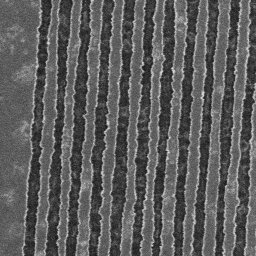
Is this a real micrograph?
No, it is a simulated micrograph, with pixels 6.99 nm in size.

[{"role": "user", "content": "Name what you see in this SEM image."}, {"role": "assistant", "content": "parallel lines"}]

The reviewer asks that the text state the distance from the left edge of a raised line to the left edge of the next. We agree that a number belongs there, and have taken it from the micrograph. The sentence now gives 0.146 micrometres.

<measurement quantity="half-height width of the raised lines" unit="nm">73.3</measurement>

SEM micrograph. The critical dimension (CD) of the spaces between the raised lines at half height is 74.1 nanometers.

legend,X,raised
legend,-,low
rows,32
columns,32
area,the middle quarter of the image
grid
-XX---XXX--XXX---XXX--XXX--XXX--
-XX---XXX--XXX---XXX--XXX--XXX--
-XX---XXX--XXX---XX---XX---XXX--
-XX---XXX--XXX---XX---XX---XXX--
-XX---XXX--XXX--XXX---XX---XX---
-X----XX---XXX---XX---XX---XX---
XXX---XXX--XXX--XXX---XX---XX---
XXX---XX---XXX--XXX---XX---XX---
XX----XX---XXX--XXX---XX---XX---
XX----XX---XXX--XXX---XX---XX---
XX----XX---XX---XXX---XX---XX---
XX----XX---XXX--XXX---XX---XX---
XX----XX---XX---XXX---XX---XX---
XX---XXX---XX---XXX--XXX---XX---
XX----X----XX---XX----XX---XX---
XX---XXX---XX---XX---XX----XX---
XX---XXX--XXX---XX---XXX--XX----
XX---XX---XXX---XXX--XXX--XXX---
XX---XXX--XXX---XX---XXX--XX---X
XX---XXX--XXX---XX---XX---XX----
XX---XX----XX---XX---XX---XXX--X
XX---XX---XXX---XX---XX---XXX--X
XX---XX---XXX---XX---XX---XXX--X
X----XX---XXX---XX---XX---XX---X
X----XX---XXX---XX---XX---XX---X
X----XX---XXX---XX---XX---XX---X
XX---XX---XX----XX---XX--XXX---X
XX--XXX--XXX----XX---XX--XXX---X
XX--XXX---XX----XX---XX--XXX---X
XX--XXX---XX----XX---XX--XXX--XX
XX--XXX---XX----XX---XX--XXX--XX
XX--XXX---XX----XX---X---XXX--XX